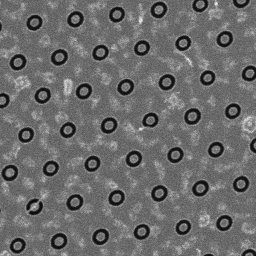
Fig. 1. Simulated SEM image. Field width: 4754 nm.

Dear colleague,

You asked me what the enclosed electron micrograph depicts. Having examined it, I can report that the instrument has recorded a regular array of ring-shaped grooves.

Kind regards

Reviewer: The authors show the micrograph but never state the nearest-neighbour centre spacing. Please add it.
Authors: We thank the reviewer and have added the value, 766 nm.